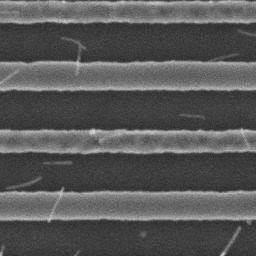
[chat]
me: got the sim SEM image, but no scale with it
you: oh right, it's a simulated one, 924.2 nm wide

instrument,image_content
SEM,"lines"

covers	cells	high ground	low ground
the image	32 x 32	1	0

11111111111111111111111111111111
11111111111111111111111111111111
11111111111111111111111111111111
00000000000000000000000000000000
00000000000000000000000000000000
00000000000000000000000000000000
00000000000000000000000000000000
00000000000000000000000000000000
11111111111111111111111111111111
11111111111111111111111111111111
11111111111111111111111111111111
00000000000000000000000000000000
00000000000000000000000000000000
00000000000000000000000000000000
00000000000000000000000000000000
00000000000000000000000000000000
11111111111111111111111111111111
11111111111111111111111111111111
11111111111111111111111111111111
00000000000000000000000000000000
00000000000000000000000000000000
00000000000000000000000000000000
00000000000000000000000000000000
00000000000000000000000000000000
11111111111111111111111111111111
11111111111111111111111111111111
11111111111111111111111111111111
11111110000000001010000000000000
00000000000000000000000000000000
00000000000000000000000000000000
00000000000000000000000000000000
00000000000000000000000000000000